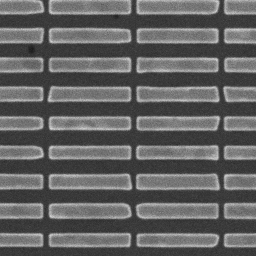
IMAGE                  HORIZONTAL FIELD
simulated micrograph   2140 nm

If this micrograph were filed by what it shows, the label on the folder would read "wiring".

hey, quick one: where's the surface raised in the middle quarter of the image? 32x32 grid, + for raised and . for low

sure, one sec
+++++++++++++++++.++++++++++++++
+++++++++++++++++.++++++++++++++
................................
................................
................................
................................
+++++++++++++++++.++++++++++++++
+++++++++++++++++.++++++++++++++
+++++++++++++++++.++++++++++++++
................................
................................
................................
................................
++++++++++++++++...+++++++++++++
+++++++++++++++++.++++++++++++++
+++++++++++++++++.++++++++++++++
...................+++++++++++++
................................
................................
................................
................................
+++++++++++++++++.++++++++++++++
+++++++++++++++++.++++++++++++++
++++++++++++++++..++++++++++++++
................................
................................
................................
................................
++++++++++++++++..++++++++++++++
+++++++++++++++++.++++++++++++++
+++++++++++++++++.++++++++++++++
................................